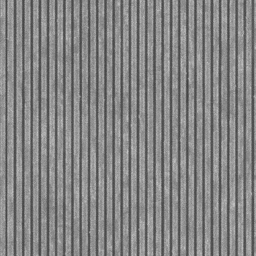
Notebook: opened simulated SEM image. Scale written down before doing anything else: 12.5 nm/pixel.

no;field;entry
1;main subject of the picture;parallel lines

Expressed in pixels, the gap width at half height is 3.5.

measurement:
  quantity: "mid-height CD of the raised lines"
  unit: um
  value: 0.0673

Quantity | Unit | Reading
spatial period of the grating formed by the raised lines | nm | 103